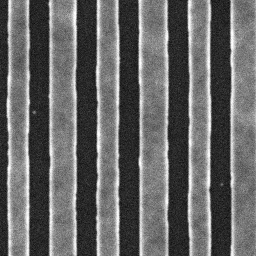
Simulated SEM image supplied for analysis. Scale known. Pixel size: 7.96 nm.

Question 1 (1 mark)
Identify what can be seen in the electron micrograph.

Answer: lines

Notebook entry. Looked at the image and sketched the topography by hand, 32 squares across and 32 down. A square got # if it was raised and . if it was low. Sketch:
.###..###...###..####...##...###
.###..###...###..####...##...###
.###..###...###..####...##...###
.###..###...###..####...##...###
.###..###...###..####...##...###
.###..###...###..####...##...###
.###..###...###..####...##...###
.###..###...###..####...##...###
.###..###...###..####...##...###
.###..###...###..####...##...###
.###..###...###..####...##...###
.###..###...###...###...##...###
.###..###...###...###...##...###
.###..###...###...###...##...###
.###..###...###...###...##...###
.###..###...###...###...##...###
.###..###...###...###...##...###
.##...###...###...###...##...###
.##...###...###...###...##...###
.###..###...###..####...##...###
.###..###...###..####...##...###
.###..###...###...###...##...###
.###..###...###...###...##...###
.###..###...###...###...##...###
.###..###...###...###...##...###
.###..###...###...###...##...###
.###..###...###...###...##...###
.###..###...###...###...##...###
.###..###...###...###...##...###
.###..###...###...###...##...###
.###..###...###...###...##...###
.###..###...###...###...##...###